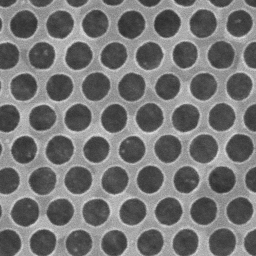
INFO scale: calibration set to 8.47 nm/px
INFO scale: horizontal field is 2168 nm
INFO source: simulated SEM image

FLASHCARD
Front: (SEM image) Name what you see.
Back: a regular array of holes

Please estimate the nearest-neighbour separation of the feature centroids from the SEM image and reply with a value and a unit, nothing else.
301 nanometres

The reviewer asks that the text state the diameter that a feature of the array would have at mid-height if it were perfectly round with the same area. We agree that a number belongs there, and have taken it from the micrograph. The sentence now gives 242 nanometers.